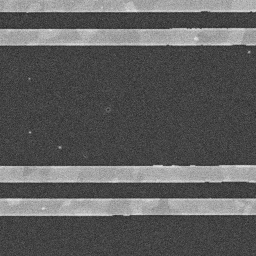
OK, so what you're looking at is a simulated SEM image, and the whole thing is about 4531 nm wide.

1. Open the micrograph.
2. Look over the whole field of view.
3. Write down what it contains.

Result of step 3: lines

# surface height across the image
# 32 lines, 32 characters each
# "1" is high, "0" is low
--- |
11111111111111111111111111111111
00000000000000000000000000000000
00000000000000000000000000000000
00000000000000000000000000000000
11111111111111111111111111111111
11111111111111111111111111111111
00000000000000000000000000000000
00000000000000000000000000000000
00000000000000000000000000000000
00000000000000000000000000000000
00000000000000000000000000000000
00000000000000000000000000000000
00000000000000000000000000000000
00000000000000000000000000000000
00000000000000000000000000000000
00000000000000000000000000000000
00000000000000000000000000000000
00000000000000000000000000000000
00000000000000000000000000000000
00000000000000000000000000000000
00000000000000000000000000000000
11111111111111111111111111111111
11111111111111111111111111111111
00000000000000000000000000000000
00000000000000000000000000000000
11111111111111111111111111111111
11111111111111111111111111111111
00000000000000000000000000000000
00000000000000000000000000000000
00000000000000000000000000000000
00000000000000000000000000000000
00000000000000000000000000000000